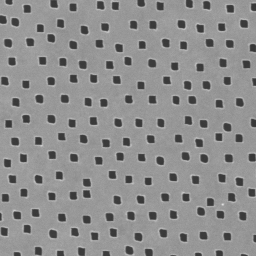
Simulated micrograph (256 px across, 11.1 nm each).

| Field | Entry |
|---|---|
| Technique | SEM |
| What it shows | a regular array of holes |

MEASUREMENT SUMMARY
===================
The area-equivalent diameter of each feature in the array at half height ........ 94.4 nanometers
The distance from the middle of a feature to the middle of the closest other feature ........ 18.4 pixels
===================